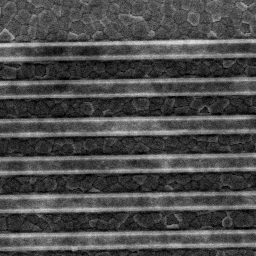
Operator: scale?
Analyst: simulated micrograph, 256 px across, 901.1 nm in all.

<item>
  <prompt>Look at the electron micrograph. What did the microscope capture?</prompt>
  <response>parallel lines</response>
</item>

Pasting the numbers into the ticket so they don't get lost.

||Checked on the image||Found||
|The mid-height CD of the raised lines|55.5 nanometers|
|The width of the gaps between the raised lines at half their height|80.6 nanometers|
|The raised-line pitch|134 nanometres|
